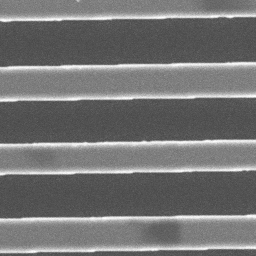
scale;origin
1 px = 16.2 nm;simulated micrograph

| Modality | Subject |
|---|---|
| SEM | lines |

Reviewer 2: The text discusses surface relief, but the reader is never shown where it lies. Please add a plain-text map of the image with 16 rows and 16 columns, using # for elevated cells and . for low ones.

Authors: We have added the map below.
################
................
................
................
################
################
................
................
................
################
################
................
................
................
################
################